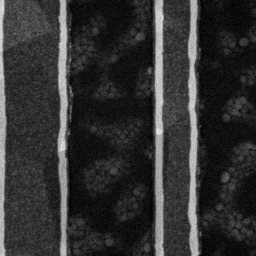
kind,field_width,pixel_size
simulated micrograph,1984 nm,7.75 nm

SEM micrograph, one or a few lines or trenches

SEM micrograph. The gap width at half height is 742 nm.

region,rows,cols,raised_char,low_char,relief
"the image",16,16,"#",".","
####......##....
####......##....
####......##....
####......##....
####......##....
####......##....
####......##....
####......##....
####......##....
####......##....
####......##....
####......##....
####......##....
####......##....
####......##....
####......##....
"